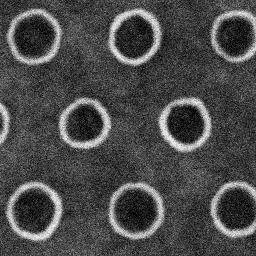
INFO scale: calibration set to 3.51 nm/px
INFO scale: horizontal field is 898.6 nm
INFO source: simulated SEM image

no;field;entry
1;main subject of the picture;raised bodies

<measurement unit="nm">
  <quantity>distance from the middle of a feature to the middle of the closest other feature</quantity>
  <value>349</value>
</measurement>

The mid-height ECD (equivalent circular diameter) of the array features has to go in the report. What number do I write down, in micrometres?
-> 0.178